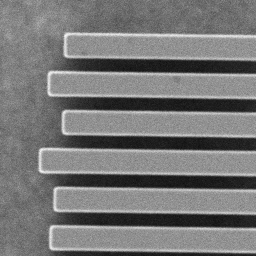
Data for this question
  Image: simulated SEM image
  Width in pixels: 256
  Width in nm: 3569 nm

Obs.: groups of lines, slits or small figures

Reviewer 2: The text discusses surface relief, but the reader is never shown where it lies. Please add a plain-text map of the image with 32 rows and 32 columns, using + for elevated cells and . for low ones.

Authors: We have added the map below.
................................
................................
................................
................................
........++++++++++++++++++++++++
........++++++++++++++++++++++++
........++++++++++++++++++++++++
................................
................................
......++++++++++++++++++++++++++
......++++++++++++++++++++++++++
......++++++++++++++++++++++++++
................................
................................
........++++++++++++++++++++++++
........++++++++++++++++++++++++
........++++++++++++++++++++++++
................................
................................
.....+++++++++++++++++++++++++++
.....+++++++++++++++++++++++++++
.....+++++++++++++++++++++++++++
................................
.......+++++....................
.......+++++++++++++++++++++++++
.......+++++++++++++++++++++++++
...............+++++++++++++++++
................................
......++++++++++++++++..........
......++++++++++++++++++++++++++
......++++++++++++++++++++++++++
.........................+++++++